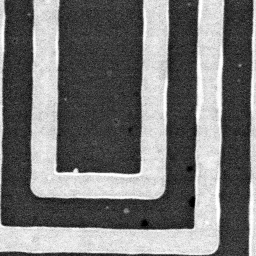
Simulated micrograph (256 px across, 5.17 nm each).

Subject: groups of lines, slits or small figures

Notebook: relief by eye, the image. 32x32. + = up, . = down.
....+++...........+++....+++....
+...+++...........+++....+++....
+...+++...........+++....+++....
....+++...........+++....+++....
....+++...........+++....+++....
....+++...........+++....+++....
....+++...........+++....+++....
....+++...........+++....+++....
....+++...........+++....+++....
....+++...........+++....++.....
....+++...........+++....++.....
....+++...........+++....++.....
....+++...........+++....++.....
....+++...........+++....+++....
....+++...........+++....+++....
....+++...........+++....+++...+
....+++...........+++....+++...+
....+++...........+++....+++...+
....+++...........+++....+++...+
....+++...........+++....+++...+
....+++...........+++....++....+
....+++..........++++....++....+
....+++++++++++++++++....++....+
....+++++++++++++++++....++....+
.....+++++++++++++++.....++.....
........................+++.....
........................+++....+
........................+++....+
+++++++.................+++....+
+++++++++++++++++++++++++++....+
+++++++++++++++++++++++++++....+
...++++..++++++++++++++++++....+